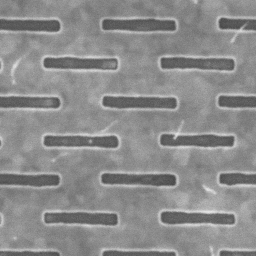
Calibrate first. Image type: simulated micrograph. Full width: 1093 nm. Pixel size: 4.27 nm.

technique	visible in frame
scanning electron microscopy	a regular array of holes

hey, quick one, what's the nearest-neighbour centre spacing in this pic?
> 69.6 px